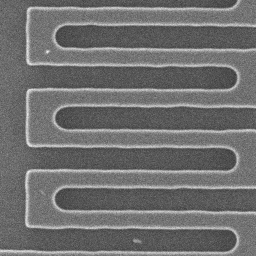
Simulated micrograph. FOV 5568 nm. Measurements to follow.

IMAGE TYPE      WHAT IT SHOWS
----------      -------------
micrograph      groups of lines, slits or small figures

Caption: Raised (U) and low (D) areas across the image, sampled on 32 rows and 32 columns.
DDDDDDDDDDDDDDDDDDDDDDDDDDDDDUUU
DDDDUUUUUUUUUUUUUUUUUUUUUUUUUUUU
DDDUUUUUUUUUUUUUUUUUUUUUUUUUUUUU
DDDUUUUDDDDDDDDDDDDDDDDDDDDDDDDD
DDDUUUUDDDDDDDDDDDDDDDDDDDDDDDDD
DDDUUUUDDDDDDDDDDDDDDDDDDDDDDDDD
DDDUUUUUUUUUUUUUUUUUUUUUUUUUUUUU
DDDUUUUUUUUUUUUUUUUUUUUUUUUUUUUU
DDDDDDDDDDDDDDDDDDDDDDDDDDDDDUUU
DDDDDDDDDDDDDDDDDDDDDDDDDDDDDDUU
DDDDDDDDDDDDDDDDDDDDDDDDDDDDDUUU
DDDDUUUUUUUUUUUUUUUUUUUUUUUUUUUU
DDDUUUUUUUUUUUUUUUUUUUUUUUUUUUUU
DDDUUUUUDDDDDDDDDDDDDDDDDDDDDDDD
DDDUUUUDDDDDDDDDDDDDDDDDDDDDDDDD
DDDUUUUDDDDDDDDDDDDDDDDDDDDDDDDD
DDDUUUUUUUUUUUUUUUUUUUUUUUUUUUUU
DDDUUUUUUUUUUUUUUUUUUUUUUUUUUUUU
DDDDDDDDDDDDDDDDDDDDDDDDDDDDUUUU
DDDDDDDDDDDDDDDDDDDDDDDDDDDDDDUU
DDDDDDDDDDDDDDDDDDDDDDDDDDDDDDUU
DDDDUUUUUUUUUUUUUUUUUUUUUUUUUUUU
DDDUUUUUUUUUUUUUUUUUUUUUUUUUUUUU
DDDUUUUUDDDDDDDDDDDDDDDDDDUDDDDD
DDDUUUUDDDDDDDDDDDDDDDDDDDDDDDDD
DDDUUUUDDDDDDDDDDDDDDDDDDDDDDDDD
DDDUUUUUUUUUUUUUUUUUUUDUUUDDDDDD
DDDUUUUUUUUUUUUUUUUUUUUUUUUUUUUU
DDDDDDUUDDUUUDUUDUUUUUUUUUUUUUUU
DDDDDDDDDDDDDDDDDDDDDDDDDDDDDDUU
DDDDDDDDDDDDDDDDDDDDDDDDDDDDDDUU
UUUUUUUUUUUUUUUUUUDDDDDDDDDDUUUU